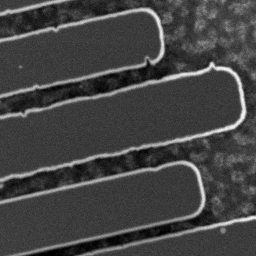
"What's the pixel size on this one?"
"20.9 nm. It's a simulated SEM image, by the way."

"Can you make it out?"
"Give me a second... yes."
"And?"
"one or a few lines or trenches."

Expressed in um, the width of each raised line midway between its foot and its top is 1.19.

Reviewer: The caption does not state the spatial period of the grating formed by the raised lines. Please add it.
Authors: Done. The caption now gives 1670 nm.